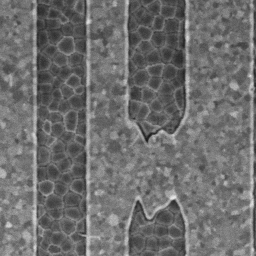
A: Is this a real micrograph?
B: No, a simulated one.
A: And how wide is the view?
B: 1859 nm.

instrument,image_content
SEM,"one or a few lines or trenches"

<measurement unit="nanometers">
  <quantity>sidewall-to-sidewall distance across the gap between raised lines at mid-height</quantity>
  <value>390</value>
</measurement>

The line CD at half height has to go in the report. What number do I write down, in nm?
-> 436